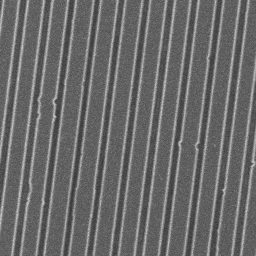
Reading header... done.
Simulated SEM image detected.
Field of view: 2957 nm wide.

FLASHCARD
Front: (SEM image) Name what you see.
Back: parallel lines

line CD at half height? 201 nm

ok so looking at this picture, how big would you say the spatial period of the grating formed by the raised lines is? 281 nm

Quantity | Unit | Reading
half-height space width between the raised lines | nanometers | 80.3